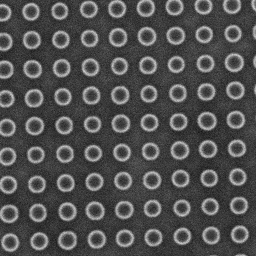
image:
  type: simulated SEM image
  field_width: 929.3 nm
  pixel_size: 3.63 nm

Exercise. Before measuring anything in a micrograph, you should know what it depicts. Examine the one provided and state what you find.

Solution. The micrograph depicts an array of small figures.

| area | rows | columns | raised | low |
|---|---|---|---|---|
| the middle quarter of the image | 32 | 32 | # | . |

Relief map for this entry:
#....####...####...####...####..
#....####...####...####....##...
#....###.....##.................
................................
................................
............................##..
#....####...####...####....###..
#....####...####...####....###..
##...####...####....###....###..
#....###.....##.................
................................
................................
................................
#.....##.....###....###....####.
##...####...####...####....####.
##...####...####....###....###..
##....##.....###....##..........
................................
................................
............................#...
#......#.....###....###....####.
##...####....####...####...####.
##...####...#####...####...####.
##....###....###....###.....##..
................................
................................
................................
.......#.....###.....##....####.
##....###....####...####...####.
##....####...####...####...####.
##....###....####...####....##..
##.....#........................